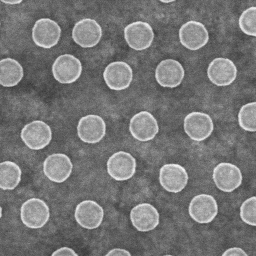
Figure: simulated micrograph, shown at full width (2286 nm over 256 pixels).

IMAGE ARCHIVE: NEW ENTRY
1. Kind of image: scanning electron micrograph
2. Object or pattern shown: a regular array of raised bodies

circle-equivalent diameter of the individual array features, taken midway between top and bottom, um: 0.245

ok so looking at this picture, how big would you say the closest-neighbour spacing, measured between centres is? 0.4 µm